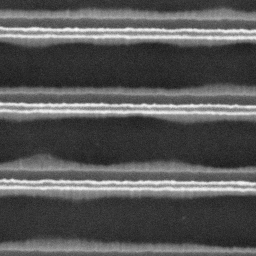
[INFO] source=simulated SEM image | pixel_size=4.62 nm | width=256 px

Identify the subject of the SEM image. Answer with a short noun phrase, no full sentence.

lines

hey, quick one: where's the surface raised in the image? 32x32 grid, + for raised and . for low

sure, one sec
................................
................................
++++++++++++++++++++++++++++++++
++++++++++++++++++++++++++++++++
++++++++++++++++++++++++++++++++
................................
................................
................................
................................
................................
................................
..+..+..........................
++++++++++++++++++++++++++++++++
++++++++++++++++++++++++++++++++
................................
................................
................................
................................
................................
................................
................................
++++++++++++++++++++++++++++++++
++++++++++++++++++++++++++++++++
++++++++++++++++++++++++++++++++
................................
................................
................................
................................
................................
................................
................................
++++++++++++++++++++++++++++++++